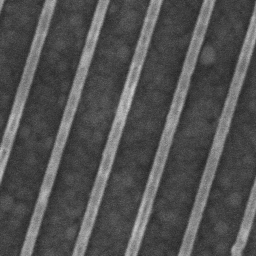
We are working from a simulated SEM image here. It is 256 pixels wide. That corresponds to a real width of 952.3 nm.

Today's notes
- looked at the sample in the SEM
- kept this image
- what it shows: parallel lines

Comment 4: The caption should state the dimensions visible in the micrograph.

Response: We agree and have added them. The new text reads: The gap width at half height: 0.152 microns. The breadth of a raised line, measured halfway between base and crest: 36.5 nm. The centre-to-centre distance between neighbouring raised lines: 188 nanometers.